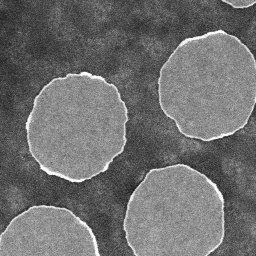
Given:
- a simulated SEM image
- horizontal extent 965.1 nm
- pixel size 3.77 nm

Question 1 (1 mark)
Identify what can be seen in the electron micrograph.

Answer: raised bodies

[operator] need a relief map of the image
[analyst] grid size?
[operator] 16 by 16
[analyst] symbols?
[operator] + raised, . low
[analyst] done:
................
................
............+++.
...........+++++
..........++++++
...++++...++++++
..++++++..++++++
..++++++...++++.
..++++++....++..
..+++++.........
...++++...++....
.........++++...
........++++++..
.++++...++++++..
++++++..++++++..
++++++..+++++...